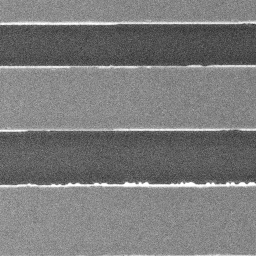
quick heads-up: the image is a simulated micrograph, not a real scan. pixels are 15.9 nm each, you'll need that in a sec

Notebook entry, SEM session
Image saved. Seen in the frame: lines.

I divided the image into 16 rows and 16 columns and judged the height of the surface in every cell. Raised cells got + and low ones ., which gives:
++++++++++++++++
+++++...........
................
................
++++++++++++++++
++++++++++++++++
++++++++++++++++
++++++++++++++++
................
................
................
................
++++++++++++++++
++++++++++++++++
++++++++++++++++
++++++++++++++++